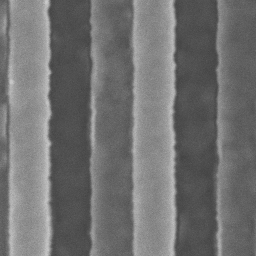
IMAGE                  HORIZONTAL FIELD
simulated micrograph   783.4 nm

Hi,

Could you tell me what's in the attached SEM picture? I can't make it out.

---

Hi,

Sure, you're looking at lines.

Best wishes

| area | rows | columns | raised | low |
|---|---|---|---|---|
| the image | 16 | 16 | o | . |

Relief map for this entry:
ooo...ooooo...oo
ooo...ooooo...oo
ooo...ooooo...oo
ooo...ooooo...oo
ooo...ooooo...oo
ooo...ooooo...oo
ooo...ooooo...oo
ooo...ooooo...oo
ooo...ooooo...oo
ooo...ooooo...oo
ooo...ooooo...oo
ooo...ooooo...oo
ooo...ooooo...oo
ooo...ooooo...oo
ooo...ooooo...oo
ooo...ooooo...oo